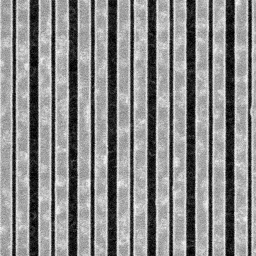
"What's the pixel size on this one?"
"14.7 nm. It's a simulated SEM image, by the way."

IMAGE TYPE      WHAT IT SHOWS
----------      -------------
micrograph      parallel lines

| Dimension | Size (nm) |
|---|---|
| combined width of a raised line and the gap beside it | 292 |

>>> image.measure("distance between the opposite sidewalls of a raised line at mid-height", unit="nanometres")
182